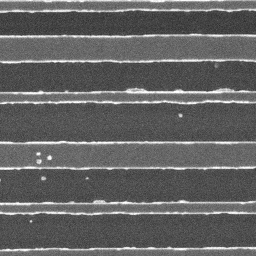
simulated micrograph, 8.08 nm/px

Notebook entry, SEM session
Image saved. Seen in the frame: lines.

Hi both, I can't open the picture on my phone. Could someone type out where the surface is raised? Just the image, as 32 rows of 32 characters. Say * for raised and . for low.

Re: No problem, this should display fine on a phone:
********************************
*..**...........................
................................
................................
........*.........**************
********************************
********************************
*****************************.**
................................
................................
................................
...........*********************
********************************
................................
................................
................................
................................
................................
********************************
********************************
********************************
................................
................................
................................
................................
********************************
********************************
................................
................................
................................
................................
********************************